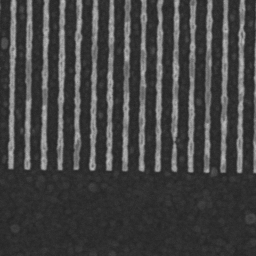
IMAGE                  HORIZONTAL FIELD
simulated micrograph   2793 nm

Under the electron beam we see parallel lines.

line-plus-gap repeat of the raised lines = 16.3 pixels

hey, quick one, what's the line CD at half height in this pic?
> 4.37 px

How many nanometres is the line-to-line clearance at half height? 134